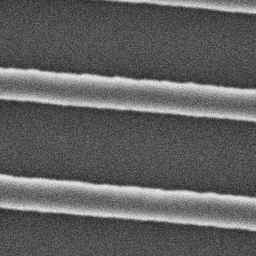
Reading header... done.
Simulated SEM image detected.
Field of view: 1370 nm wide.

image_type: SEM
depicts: lines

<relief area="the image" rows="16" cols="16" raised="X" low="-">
-------------XXX
----------------
----------------
----------------
XXX-------------
XXXXXXXXXXXXXX--
----XXXXXXXXXXXX
---------------X
----------------
----------------
----------------
XXXXXX----------
XXXXXXXXXXXXXXXX
------XXXXXXXXXX
----------------
----------------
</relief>